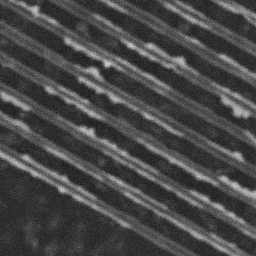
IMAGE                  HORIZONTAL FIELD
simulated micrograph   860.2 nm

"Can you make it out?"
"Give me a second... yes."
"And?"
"parallel lines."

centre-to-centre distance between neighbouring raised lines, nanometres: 88.9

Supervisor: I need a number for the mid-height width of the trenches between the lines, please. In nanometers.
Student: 55.4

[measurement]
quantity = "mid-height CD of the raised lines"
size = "0.035 microns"